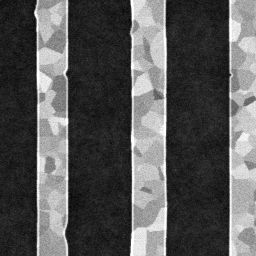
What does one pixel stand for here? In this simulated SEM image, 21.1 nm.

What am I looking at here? one or a few lines or trenches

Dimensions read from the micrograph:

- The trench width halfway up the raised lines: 1390 nm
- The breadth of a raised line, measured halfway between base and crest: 32 pixels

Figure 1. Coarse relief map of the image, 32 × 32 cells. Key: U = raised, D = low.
DDDDDUUUDDDDDDDDDUUUUDDDDDDDDUUU
DDDDUUUUDDDDDDDDDUUUUDDDDDDDDUUU
DDDDDUUUDDDDDDDDDUUUUDDDDDDDDUUU
DDDDDUUUDDDDDDDDDUUUUDDDDDDDDUUU
DDDDDUUUDDDDDDDDDUUUUDDDDDDDDUUU
DDDDDUUUDDDDDDDDDUUUUDDDDDDDDUUU
DDDDDUUUDDDDDDDDDUUUUDDDDDDDDUUU
DDDDDUUUDDDDDDDDDUUUUDDDDDDDDUUU
DDDDDUUUDDDDDDDDDUUUUDDDDDDDDUUU
DDDDDUUUDDDDDDDDDUUUUDDDDDDDDUUU
DDDDDUUUDDDDDDDDDUUUUDDDDDDDDUUU
DDDDDUUUDDDDDDDDDUUUUDDDDDDDDUUU
DDDDDUUUDDDDDDDDDUUUUDDDDDDDDUUU
DDDDDUUUDDDDDDDDDUUUUDDDDDDDDUUU
DDDDDUUUDDDDDDDDDUUUUDDDDDDDDUUU
DDDDDUUUDDDDDDDDDUUUUDDDDDDDDUUU
DDDDDUUUDDDDDDDDDUUUUDDDDDDDDUUU
DDDDDUUUDDDDDDDDDUUUUDDDDDDDDUUU
DDDDDUUUDDDDDDDDDUUUUDDDDDDDDUUU
DDDDDUUUDDDDDDDDDUUUUDDDDDDDDUUU
DDDDDUUUDDDDDDDDDUUUUDDDDDDDDUUU
DDDDDUUUDDDDDDDDDUUUUDDDDDDDDUUU
DDDDDUUUDDDDDDDDDUUUUDDDDDDDDUUU
DDDDDUUUDDDDDDDDDUUUUDDDDDDDDUUU
DDDDDUUUDDDDDDDDDUUUUDDDDDDDDUUU
DDDDDUUUDDDDDDDDDUUUUDDDDDDDDUUU
DDDDDUUUDDDDDDDDDUUUUDDDDDDDDUUU
DDDDDUUUDDDDDDDDDUUUUDDDDDDDDUUU
DDDDDUUUDDDDDDDDDUUUUDDDDDDDDUUU
DDDDDUUUDDDDDDDDDUUUUDDDDDDDDUUU
DDDDDUUUDDDDDDDDDUUUUDDDDDDDDUUU
DDDDDUUUDDDDDDDDDUUUUDDDDDDDDUUU